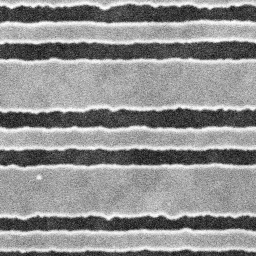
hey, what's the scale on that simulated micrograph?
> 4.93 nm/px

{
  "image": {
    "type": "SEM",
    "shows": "lines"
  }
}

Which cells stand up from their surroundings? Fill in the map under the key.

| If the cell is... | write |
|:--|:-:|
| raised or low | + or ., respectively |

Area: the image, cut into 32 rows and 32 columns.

++++++++++++++++.+++++++++++++++
................................
................................
++++++++++++++++++++++++++++++++
++++++++++++++++++++++++++++++++
...............+................
................................
+++...++.+++.++++++++++++..++.++
++++++++++++++++++++++++++++++++
++++++++++++++++++++++++++++++++
++++++++++++++++++++++++++++++++
++++++++++++++++++++++++++++++++
++++++++++++++++++++++++++++++++
++++++++++++++++++++++++++++++++
................................
................................
++++++++++++++++++++++++++++++++
++++++++++++++++++++++++++++++++
++++++++++++++++++++++++++++++++
................................
................................
++++++++++++++++++++++++++++++++
++++++++++++++++++++++++++++++++
++++++++++++++++++++++++++++++++
++++++++++++++++++++++++++++++++
++++++++++++++++++++++++++++++++
++++++++++++++++++++++++++++++++
................................
................................
++++++++++++++++++++++++++++++++
++++++++++++++++++++++++++++++++
........+.......................